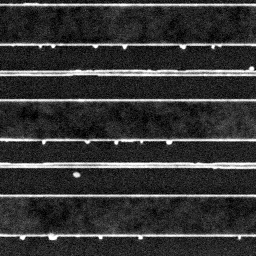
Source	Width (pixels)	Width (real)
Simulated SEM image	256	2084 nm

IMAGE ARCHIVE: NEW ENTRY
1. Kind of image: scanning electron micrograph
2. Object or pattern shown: lines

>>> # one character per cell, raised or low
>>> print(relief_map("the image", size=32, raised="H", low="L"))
LLLLLLLLLLLLLLLLLLLLLLLLLLLLLLLL
HHHHHHHHHHHHHHHHHHHHHHHHHHHHHHHH
HHHHHHHHHHHHHHHHHHHHHHHHHHHHHHHH
HHHHHHHHHHHHHHHHHHHHHHHHHHHHHHHH
HHHHHHHHHHHHHHHHHHHHHHHHHHHHHHHH
HHHHHHHHHHHHHHHHHHHHHHHHHHHHHHHH
LLLLLLLLLLLLLLLLLLLLLLLLLLLLLLLL
LLLLLLLLLLLLLLLLLLLLLLLLLLLLLLLL
LLLLLLLLLLLLLLLLLLLLLLLLLLLLLLLL
LLLLLLLLLLLLLLLLLLLLLLLLLLLLLLLL
LLLLLLLLLLLLLLLLLLLLLLLLLLLLLLLL
LLLLLLLLLLLLLLLLLLLLLLLLLLLLLLLL
LLLLLLLLLLLLLLLLLLLLLLLLLLLLLLLL
HHHHHHHHHHHHHHHHHHHHHHHHHHHHHHHH
HHHHHHHHHHHHHHHHHHHHHHHHHHHHHHHH
HHHHHHHHHHHHHHHHHHHHHHHHHHHHHHHH
HHHHHHHHHHHHHHHHHHHHHHHHHHHHHHHH
HHHHHHHHHHHHHHHHHHHHHHHHHHHHHHHH
LLLLLLLLLLLLLLLLLLLLLLLLLLLLLLLL
LLLLLLLLLLLLLLLLLLLLLLLLLLLLLLLL
LLLLLLLLLLLLLLLLLLLLLLLLLLLHHHHH
LLLLLLLLLLLLLLLLLLLLLLLLLLLLLLLL
LLLLLLLLLLLLLLLLLLLLLLLLLLLLLLLL
LLLLLLLLLLLLLLLLLLLLLLLLLLLLLLLL
HHHHHHHHHHHHHHHHHHHHHHHHHHHHHHHH
HHHHHHHHHHHHHHHHHHHHHHHHHHHHHHHH
HHHHHHHHHHHHHHHHHHHHHHHHHHHHHHHH
HHHHHHHHHHHHHHHHHHHHHHHHHHHHHHHH
HHHHHHHHHHHHHHHHHHHHHHHHHHHHHHHH
LLHHLLHHLLLLHLLLLHLLLLLLLLLLLHLL
LLLLLLLLLLLLLLLLLLLLLLLLLLLLLLLL
LLLLLLLLLLLLLLLLLLLLLLLLLLLLLLLL